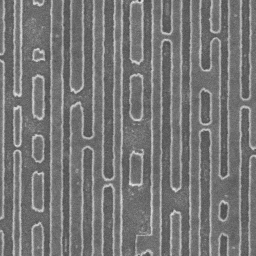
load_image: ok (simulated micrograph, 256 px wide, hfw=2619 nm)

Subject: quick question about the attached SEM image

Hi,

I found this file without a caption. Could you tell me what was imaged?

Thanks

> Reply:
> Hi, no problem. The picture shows parallel lines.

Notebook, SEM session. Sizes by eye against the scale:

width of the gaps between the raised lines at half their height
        98.5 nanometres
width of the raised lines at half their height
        109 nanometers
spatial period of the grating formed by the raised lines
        202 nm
